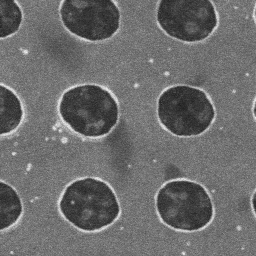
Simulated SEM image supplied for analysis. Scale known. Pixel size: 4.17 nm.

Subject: holes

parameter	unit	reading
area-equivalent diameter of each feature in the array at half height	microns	0.23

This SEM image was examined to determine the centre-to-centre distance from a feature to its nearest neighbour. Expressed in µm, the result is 0.394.